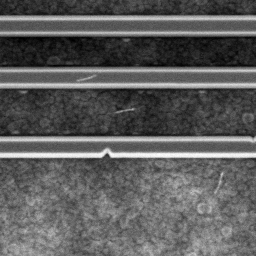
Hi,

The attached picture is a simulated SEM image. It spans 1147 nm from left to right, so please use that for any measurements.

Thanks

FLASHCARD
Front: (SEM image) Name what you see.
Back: parallel lines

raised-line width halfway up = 0.0806 microns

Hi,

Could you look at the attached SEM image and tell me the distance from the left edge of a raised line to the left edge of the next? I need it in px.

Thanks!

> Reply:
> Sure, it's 60.6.